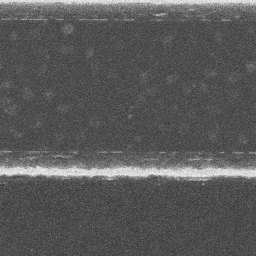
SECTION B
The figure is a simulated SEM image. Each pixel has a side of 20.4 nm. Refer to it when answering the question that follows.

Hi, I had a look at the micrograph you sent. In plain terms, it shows one or a few lines or trenches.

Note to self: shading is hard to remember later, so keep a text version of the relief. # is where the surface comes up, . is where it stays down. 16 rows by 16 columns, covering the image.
################
################
################
################
################
################
################
################
################
################
################
................
................
................
................
................